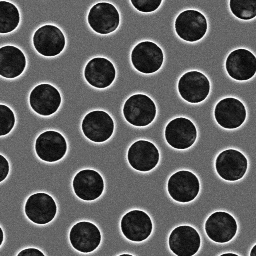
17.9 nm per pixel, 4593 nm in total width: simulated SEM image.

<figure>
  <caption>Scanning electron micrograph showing a regular array of holes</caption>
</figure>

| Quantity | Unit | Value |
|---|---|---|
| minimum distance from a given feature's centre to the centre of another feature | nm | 901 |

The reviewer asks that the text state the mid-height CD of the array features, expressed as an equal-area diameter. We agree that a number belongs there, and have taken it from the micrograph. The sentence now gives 567 nanometers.